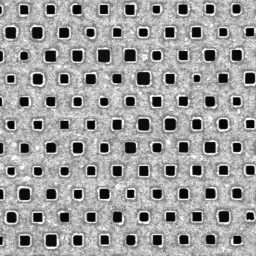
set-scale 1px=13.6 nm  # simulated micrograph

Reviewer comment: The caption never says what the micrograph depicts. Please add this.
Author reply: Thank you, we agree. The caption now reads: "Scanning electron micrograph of a regular array of holes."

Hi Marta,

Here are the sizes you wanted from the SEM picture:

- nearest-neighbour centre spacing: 357 nm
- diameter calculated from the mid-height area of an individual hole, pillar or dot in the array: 145 nm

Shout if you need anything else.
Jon